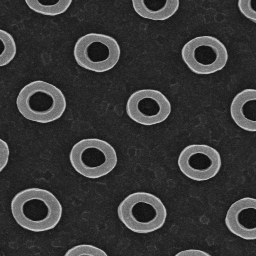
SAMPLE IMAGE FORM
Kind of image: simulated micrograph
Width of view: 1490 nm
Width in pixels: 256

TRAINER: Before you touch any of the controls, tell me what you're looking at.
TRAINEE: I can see a regular array of ring-shaped raised bodies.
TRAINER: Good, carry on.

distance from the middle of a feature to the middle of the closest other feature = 0.436 µm